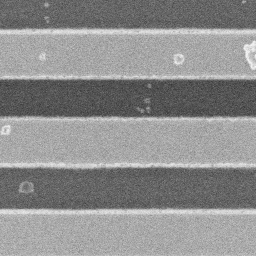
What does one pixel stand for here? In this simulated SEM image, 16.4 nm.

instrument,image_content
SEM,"lines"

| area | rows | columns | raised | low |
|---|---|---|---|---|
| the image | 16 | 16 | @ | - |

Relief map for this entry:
----------------
----------------
@@@@@@@@@@@@@@@@
@@@@@@@@@@@@@@@@
@@@@@@@@@@@@@@@@
----------------
----------------
@@@@@@@@@@@@@@@@
@@@@@@@@@@@@@@@@
@@@@@@@@@@@@@@@@
----------------
----------------
----------------
@@@@@@@@@@@@@@@@
@@@@@@@@@@@@@@@@
@@@@@@@@@@@@@@@@